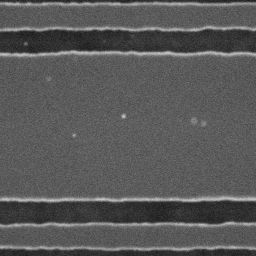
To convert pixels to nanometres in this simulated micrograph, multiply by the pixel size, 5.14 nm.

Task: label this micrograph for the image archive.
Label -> lines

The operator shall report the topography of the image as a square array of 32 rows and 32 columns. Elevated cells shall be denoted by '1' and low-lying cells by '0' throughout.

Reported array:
11110111111111101111111110001111
11111111111111111111111111111111
11111111111111111111111111111111
11111111111111111111111111111111
00000000000000000000000000000000
00000000000000000000000000000000
00000001111111111000100001100000
11111111111111111111111111111111
11111111111111111111111111111111
11111111111111111111111111111111
11111111111111111111111111111111
11111111111111111111111111111111
11111111111111111111111111111111
11111111111111111111111111111111
11111111111111111111111111111111
11111111111111111111111111111111
11111111111111111111111111111111
11111111111111111111111111111111
11111111111111111111111111111111
11111111111111111111111111111111
11111111111111111111111111111111
11111111111111111111111111111111
11111111111111111111111111111111
11111111111111111111111111111111
11111111111111111111111111111111
00000000000000000000000000000000
00000000000000000000000000000000
00000000000000000000000000000000
11111111111111111111111111111111
11111111111111111111111111111111
11111111111111111111111111111111
00000000000000000000000000000000